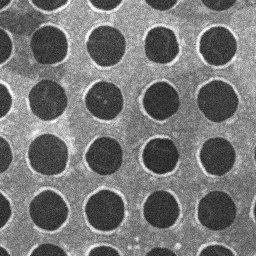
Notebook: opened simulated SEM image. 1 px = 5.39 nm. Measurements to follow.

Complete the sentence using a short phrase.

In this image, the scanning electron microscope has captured a regular array of holes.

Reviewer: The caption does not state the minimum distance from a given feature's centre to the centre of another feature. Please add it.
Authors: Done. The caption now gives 295 nm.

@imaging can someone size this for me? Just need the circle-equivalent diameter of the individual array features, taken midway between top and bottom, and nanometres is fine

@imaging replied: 213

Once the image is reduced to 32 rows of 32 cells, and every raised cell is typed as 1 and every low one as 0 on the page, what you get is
01110000111000011100001110000111
11111111111111111111111111111111
11111111111111111111111111111111
11111001111100011110011111001111
01110000111000001100001110000111
00110000011000001100001110000011
00110000111000001100001110000111
01110000111100011110001111000111
11111111111111111111111111111111
11111111111111111111111111111111
11110001111100111110011111000111
01110000111000011100001110000111
00110000111000011100001110000011
01110000111000011100001110000011
01110000111100011110011111000111
11111111111111111111111111111111
11111111111111111111111111111111
01110000111100011110011111001111
01110000111000011100001110000111
00110000111000011100001110000011
01110000111000011100001110000111
01111000111100011110011111000111
11111111111111111111111111111111
11111111111111111111111111111111
11110000111000011110001110000111
01110000111000001100001110000011
01110000011000001100000110000011
01110000111000011100001110000111
11111001111100011110011111000111
11111111111111111111111111111111
11111001111111111111111111111111
01110000111000011100001110000111